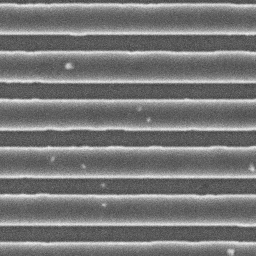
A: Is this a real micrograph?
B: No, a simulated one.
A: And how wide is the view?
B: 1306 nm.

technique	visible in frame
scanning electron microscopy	lines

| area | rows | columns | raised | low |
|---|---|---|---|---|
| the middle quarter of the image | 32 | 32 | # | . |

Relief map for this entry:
################################
################################
################################
################################
################################
................................
................................
................................
................................
################################
################################
################################
################################
################################
################################
################################
................................
................................
................................
................................
................................
################################
################################
################################
################################
################################
################################
################################
................................
................................
................................
................................